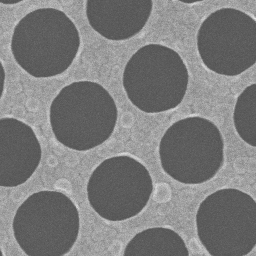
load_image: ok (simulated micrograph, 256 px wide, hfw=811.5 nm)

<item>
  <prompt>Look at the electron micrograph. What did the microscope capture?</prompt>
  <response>holes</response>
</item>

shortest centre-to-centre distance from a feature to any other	0.258	µm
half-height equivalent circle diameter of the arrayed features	212	nanometers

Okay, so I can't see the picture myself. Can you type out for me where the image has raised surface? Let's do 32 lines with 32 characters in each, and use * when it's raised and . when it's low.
*.*********........*************
****....***........********...**
***......**.......********......
**........**......*******.......
**........***....********.......
*.........*********.*****.......
**........*******.....***.......
**.......*******.......**.......
***.....********.......***.....*
.***...********.........********
.********...***........*********
*******......***.......*******..
*******.......**.......*******..
******.........**.....*******...
******.........**************...
...***........********.....**...
....***.......*******.......**..
.....**......*******........**..
.....****...********........****
.....**********.****........****
.....********.....**........****
....********.......**......*****
...********........***....******
***********........*************
****....***........*******.....*
***......**.......*******.......
**........**.....********.......
**........****.**********.......
**........*********.*****.......
**........*******.....***.......
**.......*******.......**.......
***.....********........**.....*